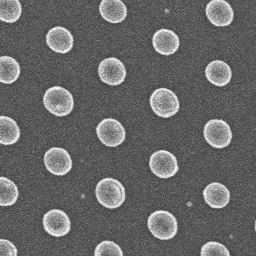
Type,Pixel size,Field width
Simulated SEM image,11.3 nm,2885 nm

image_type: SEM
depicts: a regular array of raised bodies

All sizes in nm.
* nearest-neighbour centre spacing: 684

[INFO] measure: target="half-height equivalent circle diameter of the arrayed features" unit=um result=0.302